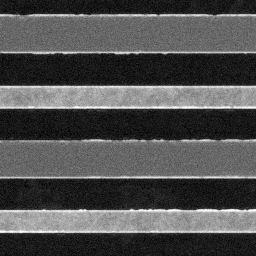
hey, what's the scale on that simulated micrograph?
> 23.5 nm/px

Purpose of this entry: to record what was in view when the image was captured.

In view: lines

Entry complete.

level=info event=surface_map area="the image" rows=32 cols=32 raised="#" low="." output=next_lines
................................
................................
################################
################################
################################
################################
################################
................................
................................
................................
................................
################################
################################
................................
................................
................................
................................
................................
################################
################################
################################
################################
................................
................................
................................
................................
################################
################################
################################
................................
................................
................................